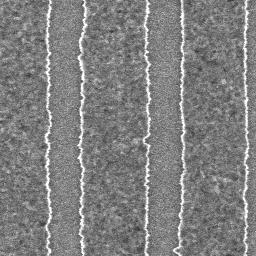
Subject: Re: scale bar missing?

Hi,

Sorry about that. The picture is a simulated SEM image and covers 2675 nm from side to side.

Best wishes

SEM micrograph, one or a few lines or trenches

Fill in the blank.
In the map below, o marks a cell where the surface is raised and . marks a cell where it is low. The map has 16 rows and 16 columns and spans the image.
ooo..oooo..oooo.
ooo..oooo..oooo.
ooo..oooo..oooo.
ooo..oooo..oooo.
ooo..oooo..oooo.
ooo..oooo..oooo.
ooo..oooo..oooo.
ooo..oooo..oooo.
ooo..oooo..oooo.
ooo..oooo..oooo.
ooo..oooo..oooo.
ooo..oooo..oooo.
ooo..oooo..oooo.
ooo..oooo..oooo.
ooo..oooo..oooo.
ooo..oooo..oooo.